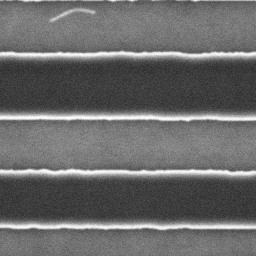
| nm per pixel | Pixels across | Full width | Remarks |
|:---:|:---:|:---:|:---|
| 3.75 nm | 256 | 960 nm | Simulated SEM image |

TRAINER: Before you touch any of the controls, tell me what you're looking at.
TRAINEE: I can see lines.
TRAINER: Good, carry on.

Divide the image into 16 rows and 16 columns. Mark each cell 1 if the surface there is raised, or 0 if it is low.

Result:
0000000000000000
0000000000000000
0000000000000000
1111111111111111
1111111111111111
1111111111111111
1111111111111111
0000000000000000
0000000000000000
0000000000000000
0000000000000000
1111111111111111
1111111111111111
1111111111111111
0000000000000000
0000000000000000